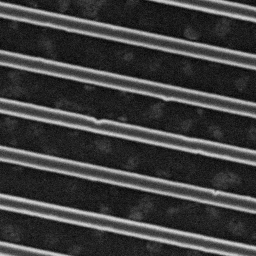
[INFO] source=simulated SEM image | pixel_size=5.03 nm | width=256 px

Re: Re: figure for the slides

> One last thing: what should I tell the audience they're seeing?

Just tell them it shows parallel lines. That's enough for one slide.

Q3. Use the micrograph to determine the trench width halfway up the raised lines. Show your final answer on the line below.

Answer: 171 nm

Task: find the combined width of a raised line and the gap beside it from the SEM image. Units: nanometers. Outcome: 236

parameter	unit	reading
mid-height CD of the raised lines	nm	63.4